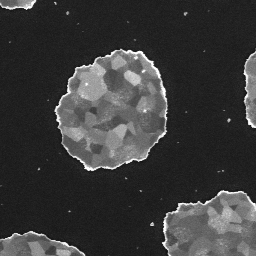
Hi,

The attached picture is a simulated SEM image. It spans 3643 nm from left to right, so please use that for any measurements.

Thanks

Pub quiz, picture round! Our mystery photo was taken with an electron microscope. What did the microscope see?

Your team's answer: raised bodies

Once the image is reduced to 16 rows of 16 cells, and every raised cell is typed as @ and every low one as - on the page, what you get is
@@--------------
----------------
----------------
-------@@-------
-----@@@@@-----@
----@@@@@@-----@
----@@@@@@-----@
----@@@@@@-----@
----@@@@@@------
----@@@@@-------
-----@@---------
----------------
-------------@@@
-----------@@@@@
----------@@@@@@
@@@@@-----@@@@@@